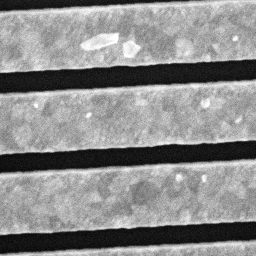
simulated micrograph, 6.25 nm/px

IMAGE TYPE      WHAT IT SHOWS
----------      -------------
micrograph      lines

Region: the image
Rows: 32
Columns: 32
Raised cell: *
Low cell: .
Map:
....................************
..******************************
********************************
********************************
********************************
********************************
********************************
*****************************...
***********.....................
................................
..........................******
.......*************************
********************************
********************************
********************************
********************************
********************************
********************************
**************..................
................................
..........................******
.......*************************
********************************
********************************
********************************
********************************
********************************
********************************
*****************...............
................................
..........................******
.......*************************